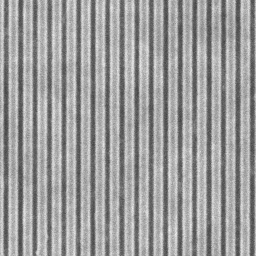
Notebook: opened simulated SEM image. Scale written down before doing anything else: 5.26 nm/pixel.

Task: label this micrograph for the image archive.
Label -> parallel lines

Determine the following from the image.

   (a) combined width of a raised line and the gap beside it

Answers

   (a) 76.2 nm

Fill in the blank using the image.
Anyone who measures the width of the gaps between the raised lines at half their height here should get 30.9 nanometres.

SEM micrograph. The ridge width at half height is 0.046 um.